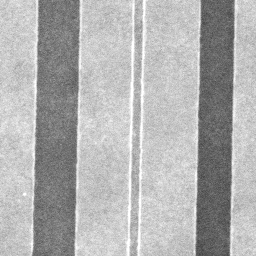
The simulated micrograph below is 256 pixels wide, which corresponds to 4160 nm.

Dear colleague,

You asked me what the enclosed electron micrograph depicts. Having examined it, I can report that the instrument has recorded lines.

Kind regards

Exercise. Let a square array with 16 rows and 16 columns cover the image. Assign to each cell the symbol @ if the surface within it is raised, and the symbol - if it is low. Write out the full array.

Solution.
@@---@@@@@@@---@
@@---@@@@@@@---@
@@---@@@@@@@---@
@@---@@@@@@@---@
@@---@@@@@@@---@
@@---@@@@@@@---@
@@---@@@@@@@---@
@@---@@@@@@@---@
@@---@@@@@@@---@
@@---@@@@@@@---@
@@---@@@@@@@---@
@@---@@@@@@@---@
@@---@@@@@@@--@@
@@---@@@@@@@--@@
@@---@@@@@@@--@@
@@---@@@@@@@--@@